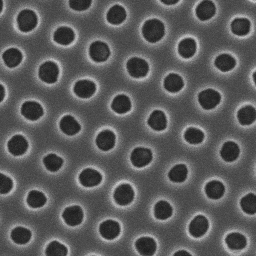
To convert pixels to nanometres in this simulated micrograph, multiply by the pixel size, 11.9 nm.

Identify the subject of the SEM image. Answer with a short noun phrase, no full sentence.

a regular array of holes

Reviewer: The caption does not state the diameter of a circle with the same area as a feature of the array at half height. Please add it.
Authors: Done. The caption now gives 250 nm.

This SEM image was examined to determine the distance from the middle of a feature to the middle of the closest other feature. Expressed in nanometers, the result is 466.